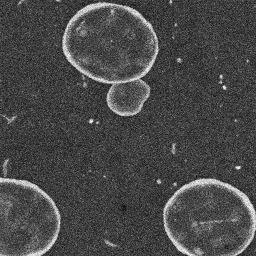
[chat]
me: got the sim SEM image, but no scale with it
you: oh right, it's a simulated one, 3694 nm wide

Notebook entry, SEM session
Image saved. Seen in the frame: raised bodies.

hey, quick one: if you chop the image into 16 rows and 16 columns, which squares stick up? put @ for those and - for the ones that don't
------@@--------
----@@@@@-------
----@@@@@@------
----@@@@@@------
-----@@@@-------
----------------
----------------
----------------
----------------
----------------
----------------
@@----------@@--
@@@--------@@@@-
@@@@------@@@@@@
@@@@------@@@@@@
@@@--------@@@@-